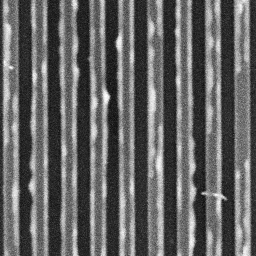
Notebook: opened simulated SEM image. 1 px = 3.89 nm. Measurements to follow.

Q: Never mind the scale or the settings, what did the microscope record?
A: parallel lines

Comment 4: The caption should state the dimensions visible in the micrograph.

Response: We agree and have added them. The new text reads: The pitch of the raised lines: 112 nanometres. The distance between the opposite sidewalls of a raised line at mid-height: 59.8 nm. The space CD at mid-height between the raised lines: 53 nm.